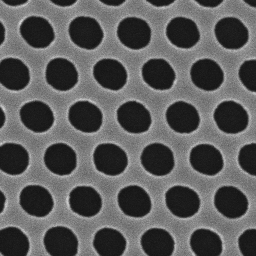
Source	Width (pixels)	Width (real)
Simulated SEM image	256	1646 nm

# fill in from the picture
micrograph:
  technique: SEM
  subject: a regular array of holes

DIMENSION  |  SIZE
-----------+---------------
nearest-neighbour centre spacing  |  309 nanometres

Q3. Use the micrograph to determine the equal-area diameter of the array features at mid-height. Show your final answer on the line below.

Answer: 216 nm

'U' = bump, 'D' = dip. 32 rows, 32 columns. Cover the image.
UDDUUUUDDUUUUDDUUUUDDUUUUDDDUUUD
UUUUUUUUUUUUUUUUUUUUUUUUUUUUUUUU
UUUDDDUUUDDDUUUDDDUUUDDDUUUDDDUU
DUDDDDDUUDDDDUUDDDDUUDDDDUUDDDDU
DUUDDDDUUDDDDUUDDDDUUDDDDUUDDDDU
UUUUDDUUUDDDDUUDDDUUUUDDUUUDDDDU
UUUUUUUUUUUUUUUUUUUUUUUUUUUUUUUU
DDDUUUDDDUUUUDDUUUUDDUUUUDDUUUUD
DDDDUUDDDUUUDDDDUUDDDDUUDDDDUUDD
DDDDUUDDDDUUDDDDUUDDDDUUDDDDUUDD
DDDUUUDDDDUUDDDDUUDDDDUUDDDDUUDD
UUUUUUUUUUUUUUUUUUUUUUUUUUUUUUUU
UUUUUUUUUUUUUUUUUUUUUUUUUUUUUUUU
UUUDDDUUUDDDUUUDDDUUUDDDUUUDDDUU
DUUDDDDUDDDDDUUDDDDUUDDDDUUDDDDU
DUUDDDDUUDDDDUUDDDDUUDDDDUUDDDDU
UUUUDDUUUUDDUUUUDDUUUUDDUUUUDDUU
UUUUUUUUUUUUUUUUUUUUUUUUUUUUUUUU
DDDUUUDDDUUUDDDUUUDDDUUUDDDUUUDD
DDDDUUDDDDUUDDDDUUDDDDUUDDDDUUDD
DDDDUUDDDDUUDDDDUUDDDDUUDDDDUUDD
DDDUUUDDDUUUUDDUUUDDDUUUUDDUUUUD
UUUUUUUUUUUUUUUUUUUUUUUUUUUUUUUU
UUUDDDUUUDDDUUUDDDUUUDDDUUUDDDUU
DUDDDDUUUDDDDUUDDDDUUDDDDUUDDDDU
DUDDDDDUUDDDDUUDDDDUUDDDDUUDDDDU
UUUDDDUUUDDDUUUDDDDUUDDDDUUDDDDU
UUUUUUUUUUUUUUUUUUUUUUUUUUUUUUUU
UDUUUUDDUUUUUDUUUUUDUUUUUUUUUUUU
DDDUUDDDDUUUDDDUUUDDDUUUDDDUUUDD
DDDDUDDDDDUUDDDDUUDDDDUUDDDDUUDD
DDDDUUDDDDUUDDDUUUDDDDUUDDDDUUDD